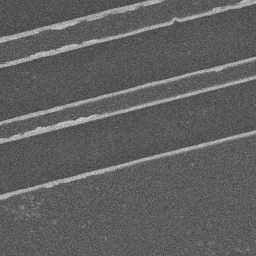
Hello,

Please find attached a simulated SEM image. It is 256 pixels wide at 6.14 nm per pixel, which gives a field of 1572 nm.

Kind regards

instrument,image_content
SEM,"one or a few lines or trenches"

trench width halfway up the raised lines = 53.2 pixels